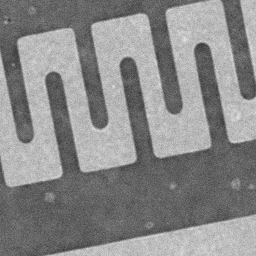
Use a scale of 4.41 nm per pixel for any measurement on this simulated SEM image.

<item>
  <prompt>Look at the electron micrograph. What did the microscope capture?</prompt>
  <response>groups of lines, slits or small figures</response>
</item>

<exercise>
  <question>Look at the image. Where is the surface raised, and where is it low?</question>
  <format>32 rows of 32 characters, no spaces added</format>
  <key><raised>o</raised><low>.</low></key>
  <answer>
........................oooo..oo
.....................ooooooo..oo
..............ooooo..ooooooo...o
............ooooooo..ooooooo...o
....ooooo...ooooooo..oooooooo..o
..ooooooo...ooooooo..oooo.ooo..o
..oooooooo..ooooooo...oo...oo..o
...ooooooo..ooo..oo...oo...oo...
...ooooooo..ooo..ooo..ooo..oo...
o..ooo..oo...oo..ooo..ooo..oo...
o..ooo..oo...oo...oo..ooo..ooo..
o..ooo..ooo..oo...oo...oo..ooo..
o...oo..ooo..ooo..oo...oo...oooo
o...oo...oo..ooo..ooo..oo...oooo
oo..oo...oo...oo..oooooooo..oooo
oo..ooo..oo...oo...ooooooo..oooo
oo..ooo..ooooooo...ooooooo..oooo
oo..ooo..oooooooo..ooooooo...oo.
ooooooo...ooooooo..ooooooo......
ooooooo...ooooooo...o...........
oooooooo..oooooo................
oooooooo........................
.oooo...........................
................................
................................
................................
................................
.............................ooo
........................oooooooo
...................ooooooooooooo
.............ooooooooooooooooooo
.........ooooooooooooooooooooooo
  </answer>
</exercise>